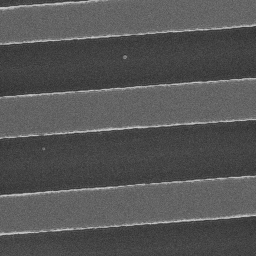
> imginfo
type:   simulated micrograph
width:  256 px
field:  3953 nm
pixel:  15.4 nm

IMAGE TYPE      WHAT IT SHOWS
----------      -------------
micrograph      lines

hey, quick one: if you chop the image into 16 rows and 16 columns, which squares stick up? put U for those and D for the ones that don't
UUUUUUUUUUUUUUUU
UUUUUUUUUUUUUUUU
UUUUDDDDDDDDDDDD
DDDDDDDDDDDDDDDD
DDDDDDDDDDDDDDDD
DDDDDDDUUUUUUUUU
UUUUUUUUUUUUUUUU
UUUUUUUUUUUUUUUU
UUDDDDDDDDDDDDDD
DDDDDDDDDDDDDDDD
DDDDDDDDDDDDDDDD
DDDDDDDDDUUUUUUU
UUUUUUUUUUUUUUUU
UUUUUUUUUUUUUUUU
UUUDDDDDDDDDDDDD
DDDDDDDDDDDDDDDD